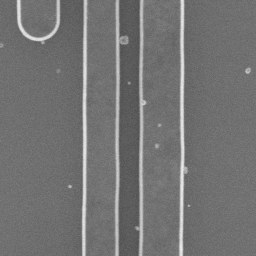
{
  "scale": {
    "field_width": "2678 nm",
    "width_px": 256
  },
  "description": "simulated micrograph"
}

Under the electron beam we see groups of lines, slits or small figures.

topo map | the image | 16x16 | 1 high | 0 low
0111011001100000
0111011001100000
0000011001100000
0000011001100000
0000011001100000
0000011001100000
0000011001100000
0000011001100000
0000011001100000
0000011001100000
0000011001100000
0000011001100000
0000011001100000
0000011001100000
0000011001100000
0000011001100000